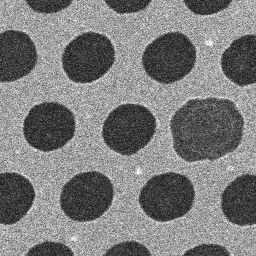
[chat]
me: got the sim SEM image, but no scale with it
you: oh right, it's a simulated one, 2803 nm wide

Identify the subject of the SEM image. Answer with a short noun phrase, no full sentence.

holes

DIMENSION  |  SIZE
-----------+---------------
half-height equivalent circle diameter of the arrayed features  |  0.569 micrometres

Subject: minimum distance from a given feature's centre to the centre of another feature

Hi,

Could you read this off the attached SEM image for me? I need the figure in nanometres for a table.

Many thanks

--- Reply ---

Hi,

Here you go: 871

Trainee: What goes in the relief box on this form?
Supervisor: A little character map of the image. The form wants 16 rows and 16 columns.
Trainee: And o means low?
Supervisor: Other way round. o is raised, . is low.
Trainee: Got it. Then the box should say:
oo..ooo..ooo..oo
oooooooooooooooo
..ooo..ooo..ooo.
..oo...oo...oo..
..oo...oo...oo..
oooooooooooooooo
oo..oooooooo...o
oo...oo...o....o
oo...o....o....o
ooooooo..oo...oo
oooooooooooooooo
..oo...oo...oo..
..oo...oo...oo..
.ooo..ooo..ooo..
oooooooooooooooo
oo..ooo..ooo..oo